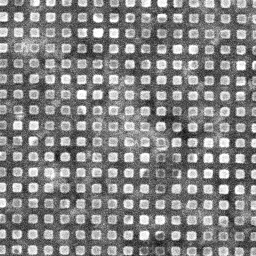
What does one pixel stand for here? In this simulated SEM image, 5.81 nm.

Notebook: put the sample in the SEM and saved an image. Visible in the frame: a regular array of raised bodies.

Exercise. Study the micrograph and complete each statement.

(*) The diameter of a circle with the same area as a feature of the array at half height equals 52.1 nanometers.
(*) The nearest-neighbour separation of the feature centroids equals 88.6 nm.